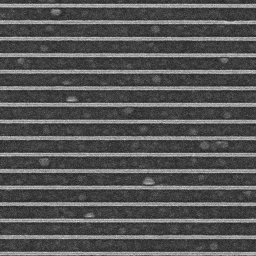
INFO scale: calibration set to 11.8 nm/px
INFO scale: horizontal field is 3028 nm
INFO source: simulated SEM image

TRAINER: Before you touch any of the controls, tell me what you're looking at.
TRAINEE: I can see parallel lines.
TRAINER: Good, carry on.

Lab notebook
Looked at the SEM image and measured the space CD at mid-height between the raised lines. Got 158 nm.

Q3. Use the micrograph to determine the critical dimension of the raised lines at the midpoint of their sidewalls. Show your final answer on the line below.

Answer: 0.0385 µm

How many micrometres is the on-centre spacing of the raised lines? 0.196